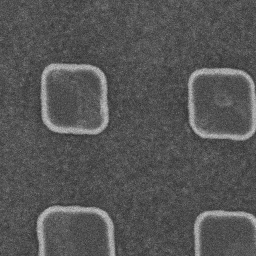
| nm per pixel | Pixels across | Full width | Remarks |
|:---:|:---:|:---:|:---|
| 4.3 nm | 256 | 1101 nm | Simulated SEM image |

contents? raised bodies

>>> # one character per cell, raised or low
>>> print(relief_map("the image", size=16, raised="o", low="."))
................
................
................
................
...ooo......ooo.
...oooo.....oooo
...oooo.....oooo
...oooo.....oooo
.............oo.
................
................
................
................
...oooo......ooo
..ooooo.....oooo
...oooo.....oooo